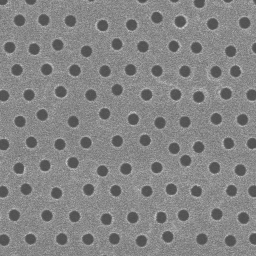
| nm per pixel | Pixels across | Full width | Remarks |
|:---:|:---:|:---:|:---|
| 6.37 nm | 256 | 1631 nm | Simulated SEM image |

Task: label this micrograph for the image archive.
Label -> a regular array of holes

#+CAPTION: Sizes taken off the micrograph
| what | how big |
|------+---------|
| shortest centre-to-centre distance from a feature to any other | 152 nanometers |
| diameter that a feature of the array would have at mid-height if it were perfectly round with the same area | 10.7 pixels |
